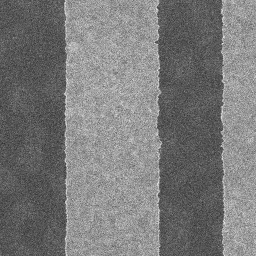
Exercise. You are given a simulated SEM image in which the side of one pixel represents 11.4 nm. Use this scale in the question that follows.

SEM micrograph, one or a few lines or trenches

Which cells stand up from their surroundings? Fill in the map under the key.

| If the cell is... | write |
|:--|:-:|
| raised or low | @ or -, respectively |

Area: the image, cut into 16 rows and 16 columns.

----@@@@@@----@@
----@@@@@@----@@
----@@@@@@----@@
----@@@@@@----@@
----@@@@@@----@@
----@@@@@@----@@
----@@@@@@----@@
----@@@@@@----@@
----@@@@@@----@@
----@@@@@@----@@
----@@@@@@----@@
----@@@@@@----@@
----@@@@@@----@@
----@@@@@@----@@
----@@@@@@----@@
----@@@@@@----@@